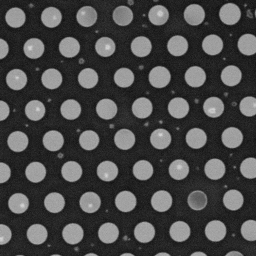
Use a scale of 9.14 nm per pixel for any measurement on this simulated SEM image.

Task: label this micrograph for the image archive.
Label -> an array of small figures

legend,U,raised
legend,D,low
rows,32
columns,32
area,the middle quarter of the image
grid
DDDDDDDDDDDDDDDDDDDDDDDDDDDDDDDD
DDDDDUUDDDDDDDUUDDDDDDUUUUDDDDDU
DDDDUUUUDDDDDUUUUDDDDUUUUUDDDDUU
DDDDUUUUDDDDDUUUUDDDDUUUUUDDDDUU
DDDDUUUUDDDDDUUUUDDDDDUUUUDDDDDU
DDDDDUUUDDDDDDUUDDDDDDUUUDDDDDDD
DDDDDDDDDDDDDDDDDDDDDDDDDDDDDDDD
DDDDDDDDDDDDDDDDDDDDDDDDDDDDDDDD
DDDDDDDDDDDDDDDDDDDUDDDDDDDDDDDD
UUUDDDDDDUUUDDDDDDUUUUDDDDUUUUUD
UUUUDDDDUUUUUDDDDUUUUUDDDDUUUUUD
UUUUDDDDUUUUUDDDDUUUUUDDDDUUUUUD
UUUUDDDDUUUUUDDDDDUUUUDDDDDUUUUD
UUUDDDDDDDUUDDDDDDDDDDDDDDDDUDDD
DDDDDDDDDDDDDDDDDDDDDDDDDDDDDDDD
DDDDDDDDDDDDDDDDDDDDDDDDDDDDDDDD
DDDDDDDDDDDDDDUUDDDDDDDUUDDDDDDD
DDDDUUUUDDDDDUUUUDDDDDUUUUDDDDDU
DDDDUUUUUDDDDUUUUUDDDDUUUUUDDDDU
DDDDUUUUUDDDDUUUUUDDDDUUUUUDDDDU
DDDDUUUUDDDDDUUUUDDDDDUUUUDDDDDU
DDDDDDDDDDDDDDDDDDDDDDDDDDDDDDDD
DDDDDDDDDDDDDDDDDDDDDDDDDDDDDDDD
DDDDDDDDDDDDDDDDDDDDDDDDDDDDDDDD
DUUDDDDDDDUUDDDDDDUUUDDDDDDUUUDD
UUUUDDDDDUUUUDDDDDUUUUDDDDDUUUUD
UUUUDDDDUUUUUDDDDUUUUUDDDDUUUUUD
UUUUDDDDUUUUUDDDDUUUUUDDDDDUUUUD
UUUUDDDDDUUUUDDDDDUUUDDDDDDUUUDD
DDDDDDDDDDDDDDDDDDDDDDDDDDDDDDDD
DDDDDDDDDDDDDDDDDDDDDDDDDDDDDDDD
DDDDDDDDDDDDDDDDDDDDDDDDDDDDDDDD